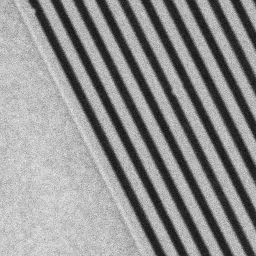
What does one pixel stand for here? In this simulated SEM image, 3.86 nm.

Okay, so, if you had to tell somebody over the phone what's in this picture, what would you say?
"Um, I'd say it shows parallel lines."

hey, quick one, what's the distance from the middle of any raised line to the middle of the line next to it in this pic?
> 77.5 nm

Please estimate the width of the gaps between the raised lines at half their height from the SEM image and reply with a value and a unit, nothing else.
0.0306 microns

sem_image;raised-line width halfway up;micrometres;0.0453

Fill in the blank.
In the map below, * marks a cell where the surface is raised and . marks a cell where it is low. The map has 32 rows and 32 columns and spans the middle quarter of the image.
..***..***...***...***..***...**
..***...***...***..***...***..**
...***..***...***...***..***...*
*..***...***...***..***...***..*
*...***..***...***...***..***...
**..***...***...***..***...***..
**...***..***...***...***..***..
***..***...***...***..***..****.
***...***..***...***...***..***.
.***..***...***...***..***...***
.***...***..***...***...***..***
..***..***...***...***..***...**
..***...***..***...***...***..**
...***..***...***...***..***...*
...***...***..***...***...***..*
....***..***...***...***..***...
....***...***..***...***...***..
.....***..***...***...***..***..
.....***...***..***...***...***.
......***..***...***...***..***.
......***...***..***...***...***
.......***..***...***...***..***
.......***...***..***...***...**
........***..***...***...***..**
........****..***..***...***...*
.........***..***...***...***..*
.........****..***..***...***...
..........***..***...***...***..
..........****..***..***...***..
...........***..****..***...***.
...........***...***..***...***.
............***..****..***..****